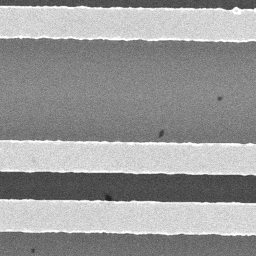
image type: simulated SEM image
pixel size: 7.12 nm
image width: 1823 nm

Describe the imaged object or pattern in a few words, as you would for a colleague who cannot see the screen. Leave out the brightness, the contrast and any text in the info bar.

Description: lines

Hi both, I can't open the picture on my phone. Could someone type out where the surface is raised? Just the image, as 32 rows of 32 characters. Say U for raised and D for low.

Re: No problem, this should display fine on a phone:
DDDDDDDDDDDDDDDDDDDDDDDDDDDDDDDD
UUUUUUUUUUUUUUUUUUUUUUUUUUUUUUUU
UUUUUUUUUUUUUUUUUUUUUUUUUUUUUUUU
UUUUUUUUUUUUUUUUUUUUUUUUUUUUUUUU
UUUUUUUUUUUUUUUUUUUUUUUUUUUUUUUU
DDDDDDDDDDDDDDDDDDDDDDDDDDDDDDDD
DDDDDDDDDDDDDDDDDDDDDDDDDDDDDDDD
DDDDDDDDDDDDDDDDDDDDDDDDDDDDDDDD
DDDDDDDDDDDDDDDDDDDDDDDDDDDDDDDD
DDDDDDDDDDDDDDDDDDDDDDDDDDDDDDDD
DDDDDDDDDDDDDDDDDDDDDDDDDDDDDDDD
DDDDDDDDDDDDDDDDDDDDDDDDDDDDDDDD
DDDDDDDDDDDDDDDDDDDDDDDDDDDDDDDD
DDDDDDDDDDDDDDDDDDDDDDDDDDDDDDDD
DDDDDDDDDDDDDDDDDDDDDDDDDDDDDDDD
DDDDDDDDDDDDDDDDDDDDDDDDDDDDDDDD
DDDDDDDDDDDDDDDDDDDDDDDDDDDDDDDD
DDDDDDDDDDDDDDDDDDDDDDDDDDDDDDDD
UUUUUUUUUUUUUUUUUUUUUUUUUUUUUUUU
UUUUUUUUUUUUUUUUUUUUUUUUUUUUUUUU
UUUUUUUUUUUUUUUUUUUUUUUUUUUUUUUU
DDDDDDDDDDDDDDDUUUUUUUUUUUUUUUUU
DDDDDDDDDDDDDDDDDDDDDDDDDDDDDDDD
DDDDDDDDDDDDDDDDDDDDDDDDDDDDDDDD
DDDDDDDDDDDDDDDDDDDDDDDDDDDDDDDD
UUUUUUUUUUUUUUUUUUUUUUUUUUUUUUUU
UUUUUUUUUUUUUUUUUUUUUUUUUUUUUUUU
UUUUUUUUUUUUUUUUUUUUUUUUUUUUUUUU
UUUUUUUUUUUUUUUUUUUUUUUUUUUUUUUU
DDDDDDDDDDDDDDDDDDDDDDDDDDDDDDDD
DDDDDDDDDDDDDDDDDDDDDDDDDDDDDDDD
DDDDDDDDDDDDDDDDDDDDDDDDDDDDDDDD